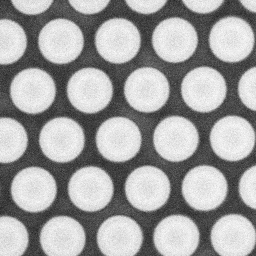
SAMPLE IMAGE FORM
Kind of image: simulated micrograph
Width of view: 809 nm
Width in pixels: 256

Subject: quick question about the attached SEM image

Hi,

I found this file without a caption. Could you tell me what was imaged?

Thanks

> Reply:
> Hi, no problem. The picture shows an array of small figures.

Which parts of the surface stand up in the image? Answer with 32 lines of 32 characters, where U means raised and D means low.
DDUUUUDDDUUUUDDDUUUUUDDUUUUUDDUU
DDDUUDDDDDUUDDDDDUUDDDDDDUDDDDDD
DDDDDDDUDDDDDDUUDDDDDUUDDDDDUUDD
UUUDDUUUUUDDUUUUUDDDUUUUDDDUUUUD
UUUDDUUUUUDDUUUUUDDUUUUUUDUUUUUU
UUUDDUUUUUDDUUUUUDDUUUUUUDUUUUUU
UUUDDUUUUUDDUUUUUDDDUUUUDDDUUUUD
UUDDDDUUUDDDDUUUDDDDDUUDDDDDUUDD
DDDDDDDDDDDDDDDDDDUDDDDDDUDDDDDD
DDUUUUDDDUUUUDDDUUUUUDDUUUUUDDUU
DUUUUUUDDUUUUUDDUUUUUDDUUUUUDDUU
DUUUUUUDDUUUUUDDUUUUUDDUUUUUDDUU
DDUUUUUDDUUUUUDDUUUUUDDUUUUUDDUU
DDUUUUDDDDUUUDDDDUUUDDDDUUUDDDDU
DDDDDDDDDDDDDDDDDDDDDDDDDDDDDDDD
UUDDDDUUUUDDDUUUUDDDUUUUDDDUUUUD
UUUDDUUUUUDDUUUUUDDUUUUUUDUUUUUU
UUUDDUUUUUDDUUUUUUDUUUUUUDUUUUUU
UUUDDUUUUUDDUUUUUDDUUUUUDDDUUUUU
UUUDDDUUUUDDDUUUUDDDUUUUDDDUUUUD
DDDDDDDDDDDDDDDDDDDDDDDDDDDDDDDD
DDDUUUDDDDUUUDDDDUUUDDDDUUUDDDDU
DDUUUUUDDUUUUUDDUUUUUDDUUUUUDDUU
DUUUUUUDDUUUUUDDUUUUUDDUUUUUDDUU
DDUUUUUDDUUUUUDDUUUUUDDUUUUUDDUU
DDUUUUDDDUUUUDDDUUUUDDDDUUUDDDDU
DDDDDDDDDDDDDDDDDDDDDDDDDDDDDDDD
UUDDDDUUUDDDDUUUUDDDUUUUDDDUUUUD
UUUDDUUUUUDDUUUUUDDDUUUUUDDUUUUU
UUUDDUUUUUUDUUUUUUDUUUUUUDUUUUUU
UUUDDUUUUUUDUUUUUUDUUUUUUDDUUUUU
UUUDDDUUUUDDDUUUUDDDUUUUDDDUUUUD